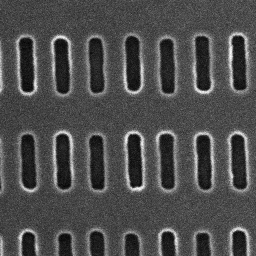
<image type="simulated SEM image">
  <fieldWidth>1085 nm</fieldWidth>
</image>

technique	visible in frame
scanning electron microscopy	a regular array of holes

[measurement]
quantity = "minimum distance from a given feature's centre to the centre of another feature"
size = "146 nanometres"